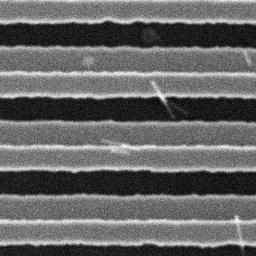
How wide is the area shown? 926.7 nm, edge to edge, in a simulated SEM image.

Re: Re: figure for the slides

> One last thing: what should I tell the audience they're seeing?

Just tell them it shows lines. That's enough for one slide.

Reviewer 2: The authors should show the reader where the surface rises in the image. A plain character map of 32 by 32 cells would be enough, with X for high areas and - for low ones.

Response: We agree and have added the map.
XXXXXXXXXXXXXXXXXXXXXXXXXXXXXXXX
XXXXXXXXXXXXXXXXXXXXXXXXXXXXXXXX
XXXXXXXXXXXXXXXXXXXXXXXXXXXXXXXX
--------------------------------
--------------------------------
--------------------------------
XXXXXXXXXXXXXXXXXXXXXXXXXXXXXXXX
XXXXXXXXXXXXXXXXXXXXXXXXXXXXXXXX
XXXXXXXXXXXXXXXXXXXXXXXXXXXXXXXX
XXXXXXXXXXXXXXXXXXXXXXXXXXXXXXXX
XXXXXXXXXXXXXXXXXXXXXXXXXXXXXXXX
XXXXXXXXXXXXXXXXXXXXXXXXXXXXXXXX
--------------------------------
--------------------------------
--------------------------------
XXXXXXXXXXXXXXXXXXXXXXXXXXXXXXXX
XXXXXXXXXXXXXXXXXXXXXXXXXXXXXXXX
XXXXXXXXXXXXXXXXXXXXXXXXXXXXXXXX
XXXXXXXXXXXXXXXXXXXXXXXXXXXXXXXX
XXXXXXXXXXXXXXXXXXXXXXXXXXXXXXXX
XXXXXXXXXXXXXXXXXXXXXXXXXXXXXXXX
--------------------------------
--------------------------------
--------------------------------
XX--XX--XXXXX----X-XX--XX-XXXX--
XXXXXXXXXXXXXXXXXXXXXXXXXXXXXXXX
XXXXXXXXXXXXXXXXXXXXXXXXXXXXXXXX
XXXXXXXXXXXXXXXXXXXXXXXXXXXXXXXX
XXXXXXXXXXXXXXXXXXXXXXXXXXXXXXXX
XXXXXXXXXXXXXXXXXXXXXXXXXXXXXXXX
X---X------XXXXXXX-XXXXXXXXX--XX
--------------------------------